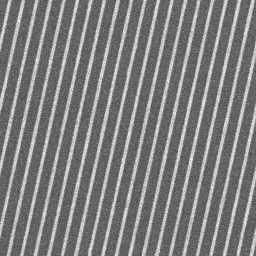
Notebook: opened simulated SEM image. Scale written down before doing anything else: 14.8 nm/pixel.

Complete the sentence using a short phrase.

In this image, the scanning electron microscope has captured parallel lines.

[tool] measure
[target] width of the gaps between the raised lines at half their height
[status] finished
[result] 10.8 px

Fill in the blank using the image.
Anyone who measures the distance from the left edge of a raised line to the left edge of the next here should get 195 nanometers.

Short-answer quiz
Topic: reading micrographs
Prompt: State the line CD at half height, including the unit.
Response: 39.7 nanometers